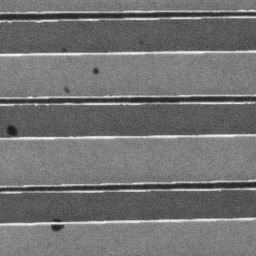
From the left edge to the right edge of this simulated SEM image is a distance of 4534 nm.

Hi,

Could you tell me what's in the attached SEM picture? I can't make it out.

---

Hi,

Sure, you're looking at lines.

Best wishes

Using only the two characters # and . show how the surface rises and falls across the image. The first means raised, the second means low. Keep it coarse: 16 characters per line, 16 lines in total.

################
................
................
################
################
################
#######.........
................
..............##
################
################
################
................
................
################
################